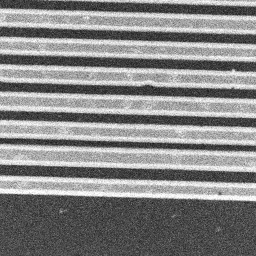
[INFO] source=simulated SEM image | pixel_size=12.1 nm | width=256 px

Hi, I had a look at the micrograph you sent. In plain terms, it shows parallel lines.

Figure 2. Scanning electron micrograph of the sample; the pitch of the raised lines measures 335 nanometers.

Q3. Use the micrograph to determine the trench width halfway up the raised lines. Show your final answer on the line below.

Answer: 166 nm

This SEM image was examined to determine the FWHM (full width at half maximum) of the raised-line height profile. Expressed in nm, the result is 175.